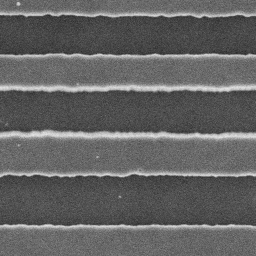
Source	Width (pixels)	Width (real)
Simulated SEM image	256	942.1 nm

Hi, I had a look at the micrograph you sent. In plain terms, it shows lines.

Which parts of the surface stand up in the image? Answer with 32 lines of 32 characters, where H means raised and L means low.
HHHHHHHHHHHHHHHHHHHHHHHHHHHHHHHH
HHHHHHHHHHHHHHHHHHHHHHHHHHHHHHHH
LLLLLLLLLLLLLLLLLLLLLLLLLLLLLLLL
LLLLLLLLLLLLLLLLLLLLLLLLLLLLLLLL
LLLLLLLLLLLLLLLLLLLLLLLLLLLLLLLL
LLLLLLLLLLLLLLLLLLLLLLLLLLLLLLLL
LLLLLLLLLLLLLLLLLLLLLLLLLLLLLLLL
HHHHHHHHHHHHHHHHHHHHHHHHHHHHHHHH
HHHHHHHHHHHHHHHHHHHHHHHHHHHHHHHH
HHHHHHHHHHHHHHHHHHHHHHHHHHHHHHHH
HHHHHHHHHHHHHHHHHHHHHHHHHHHHHHHH
LLLLLLLLLLLLLLLLLLLLLLLLLLLLLLLL
LLLLLLLLLLLLLLLLLLLLLLLLLLLLLLLL
LLLLLLLLLLLLLLLLLLLLLLLLLLLLLLLL
LLLLLLLLLLLLLLLLLLLLLLLLLLLLLLLL
LLLLLLLLLLLLLLLLLLLLLLLLLLLLLLLL
LLLLLLLLLLLLLLLLLLLLLLLLLLLLLLLL
HHHHHHHHHHHHHHHHHHHHHHHHHHHHHHHH
HHHHHHHHHHHHHHHHHHHHHHHHHHHHHHHH
HHHHHHHHHHHHHHHHHHHHHHHHHHHHHHHH
HHHHHHHHHHHHHHHHHHHHHHHHHHHHHHHH
HHHHHHHHHHHHHHHHHHHHHHHHHHHHHHHH
LLLLLLLLLLLLLLLLLLLLLLLLLLLLLLLL
LLLLLLLLLLLLLLLLLLLLLLLLLLLLLLLL
LLLLLLLLLLLLLLLLLLLLLLLLLLLLLLLL
LLLLLLLLLLLLLLLLLLLLLLLLLLLLLLLL
LLLLLLLLLLLLLLLLLLLLLLLLLLLLLLLL
LLLLLLLLLLLLLLLLLLLLLLLLLLLLLLLL
HHHHHHHHHHHHHHHHHHHHHHHHHHHHHHHH
HHHHHHHHHHHHHHHHHHHHHHHHHHHHHHHH
HHHHHHHHHHHHHHHHHHHHHHHHHHHHHHHH
HHHHHHHHHHHHHHHHHHHHHHHHHHHHHHHH